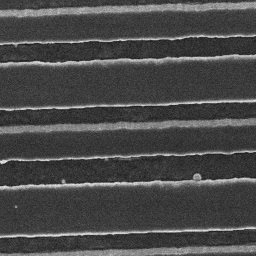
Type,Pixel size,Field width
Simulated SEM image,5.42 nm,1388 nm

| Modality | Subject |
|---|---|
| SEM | lines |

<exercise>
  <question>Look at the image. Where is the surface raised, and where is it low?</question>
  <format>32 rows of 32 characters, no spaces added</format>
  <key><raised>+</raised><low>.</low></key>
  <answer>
................................
......++++++++++++++++++++++++++
++++++++++++++++++++++++++++++++
++++++++++++++++++++++++++++++++
++++++++++++++++++++++++++++++++
+...............................
................................
..............++++++++++++++++++
++++++++++++++++++++++++++++++++
++++++++++++++++++++++++++++++++
++++++++++++++++++++++++++++++++
++++++++++++++++++++++++++++++++
++++++++++++++++++++++++++++++++
++++++++........................
................................
....................++++++++++++
++++++++++++++++++++++++++++++++
++++++++++++++++++++++++++++++++
++++++++++++++++++++++++++++++++
++++++++++++++++++..............
................................
................................
............................++++
++++++++++++++++++++++++++++++++
++++++++++++++++++++++++++++++++
++++++++++++++++++++++++++++++++
++++++++++++++++++++++++++++++++
++++++++++++++++++++++++++++++++
++++++++++++++++++++++++++++++++
++++++++........................
................................
..................++++++++++++++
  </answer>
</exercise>